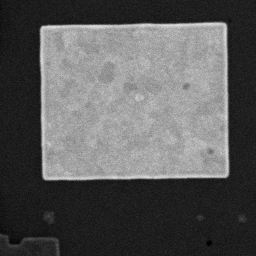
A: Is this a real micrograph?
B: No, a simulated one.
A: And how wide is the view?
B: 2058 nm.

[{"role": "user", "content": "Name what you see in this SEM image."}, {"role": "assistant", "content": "wiring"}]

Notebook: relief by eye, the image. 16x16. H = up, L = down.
LLLLLLLLLLLLLLLL
LLLLLLLLLLLLLLLL
LLLHHHHHHHHHHHLL
LLLHHHHHHHHHHHLL
LLLHHHHHHHHHHHLL
LLLHHHHHHHHHHHLL
LLLHHHHHHHHHHHLL
LLLHHHHHHHHHHHLL
LLLHHHHHHHHHHHLL
LLLHHHHHHHHHHHLL
LLLHHHHHHHHHHHLL
LLLLLLLLLLLLLLLL
LLLLLLLLLLLLLLLL
LLLLLLLLLLLLLLLL
LLLLLLLLLLLLLLLL
HHHHLLLLLLLLLLLL